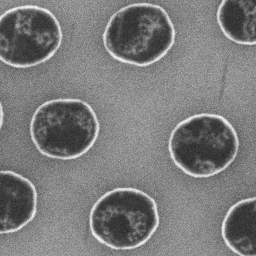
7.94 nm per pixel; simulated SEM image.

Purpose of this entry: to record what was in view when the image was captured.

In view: raised bodies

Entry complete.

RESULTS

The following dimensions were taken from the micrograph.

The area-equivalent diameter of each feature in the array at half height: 509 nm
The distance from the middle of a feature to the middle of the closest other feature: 859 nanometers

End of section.